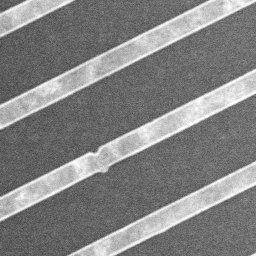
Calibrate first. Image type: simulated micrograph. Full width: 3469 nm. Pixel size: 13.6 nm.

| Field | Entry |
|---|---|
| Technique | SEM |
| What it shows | one or a few lines or trenches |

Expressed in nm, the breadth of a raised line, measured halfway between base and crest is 259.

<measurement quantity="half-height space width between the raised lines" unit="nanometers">858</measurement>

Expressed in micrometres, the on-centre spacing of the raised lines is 1.11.